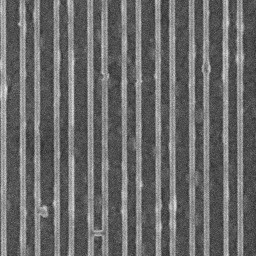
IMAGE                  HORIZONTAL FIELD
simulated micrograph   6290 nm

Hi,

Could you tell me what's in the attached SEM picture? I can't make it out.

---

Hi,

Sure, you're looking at parallel lines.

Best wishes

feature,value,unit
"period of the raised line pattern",415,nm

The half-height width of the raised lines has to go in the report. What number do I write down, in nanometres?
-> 114